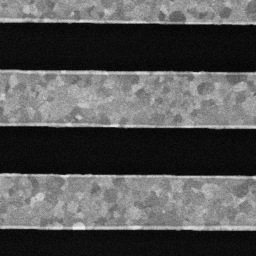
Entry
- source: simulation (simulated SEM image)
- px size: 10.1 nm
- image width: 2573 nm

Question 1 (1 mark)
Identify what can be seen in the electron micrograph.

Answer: lines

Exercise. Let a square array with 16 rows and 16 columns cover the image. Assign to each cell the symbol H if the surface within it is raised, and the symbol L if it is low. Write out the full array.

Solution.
HHHHHHHHHHHHHHHH
LLLLLLLLLLLLLLLL
LLLLLLLLLLLLLLLL
LLLLLLLLLLLLLLLL
HHHHHHHHHHHLLLLL
HHHHHHHHHHHHHHHH
HHHHHHHHHHHHHHHH
HHHHHHHHHHHHHHHH
LLLLLLLLLLLLLLLL
LLLLLLLLLLLLLLLL
LLLLLLLLLLLLLLLL
HHHHHHHHHHHHHHHH
HHHHHHHHHHHHHHHH
HHHHHHHHHHHHHHHH
LLLLLLLLLLLLLLLL
LLLLLLLLLLLLLLLL